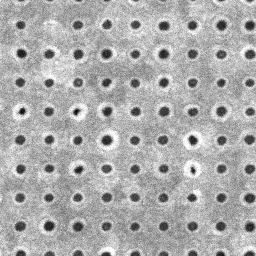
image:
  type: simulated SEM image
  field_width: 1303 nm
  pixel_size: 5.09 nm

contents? a regular array of holes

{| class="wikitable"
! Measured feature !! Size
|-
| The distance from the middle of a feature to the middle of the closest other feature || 143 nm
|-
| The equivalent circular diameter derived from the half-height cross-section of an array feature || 0.0562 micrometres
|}